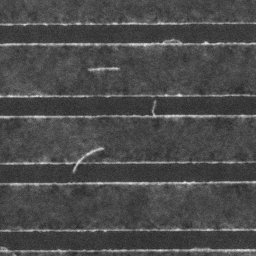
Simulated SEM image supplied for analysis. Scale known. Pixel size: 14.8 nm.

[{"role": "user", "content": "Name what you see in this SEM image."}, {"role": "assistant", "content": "lines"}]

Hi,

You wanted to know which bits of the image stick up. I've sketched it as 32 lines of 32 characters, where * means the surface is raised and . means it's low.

********************************
********************************
********************************
................................
................................
********************************
********************************
********************************
********************************
********************************
********************************
********************************
................................
................................
............********************
********************************
********************************
********************************
********************************
********************************
................................
................................
................................
********************************
********************************
********************************
********************************
********************************
********************************
................................
................................
********************************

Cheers